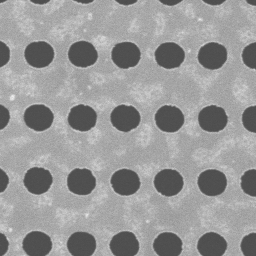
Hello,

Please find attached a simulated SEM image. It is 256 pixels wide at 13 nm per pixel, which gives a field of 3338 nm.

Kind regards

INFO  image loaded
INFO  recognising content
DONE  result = a regular array of holes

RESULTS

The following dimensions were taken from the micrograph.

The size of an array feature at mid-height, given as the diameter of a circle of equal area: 375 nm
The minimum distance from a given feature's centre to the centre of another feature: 563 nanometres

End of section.